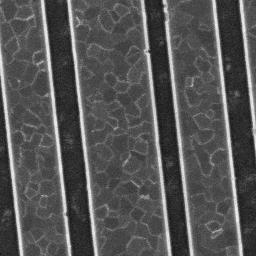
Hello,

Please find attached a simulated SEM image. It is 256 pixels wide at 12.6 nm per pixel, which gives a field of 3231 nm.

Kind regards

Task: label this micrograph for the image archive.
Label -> one or a few lines or trenches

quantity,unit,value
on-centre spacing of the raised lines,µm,1.07